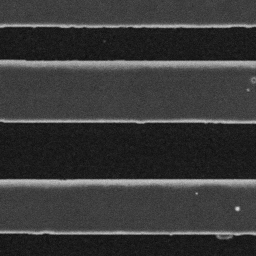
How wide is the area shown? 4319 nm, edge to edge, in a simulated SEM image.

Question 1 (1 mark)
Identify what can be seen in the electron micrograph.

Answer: lines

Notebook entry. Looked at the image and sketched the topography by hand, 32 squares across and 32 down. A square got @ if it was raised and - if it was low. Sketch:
@@@@@@@@@@@@@@@@@@@@@@@@@@@@@@@@
@@@@@@@@@@@@@@@@@@@@@@@@@@@@@@@@
@@@@@@@@@@@@@@@@@@@@@@@@@@@@@@@@
--------------------------------
--------------------------------
--------------------------------
--------------------------------
--------------------------------
@@@@@@@@@@@@@@@@@@@@@@@@@@@@@@@@
@@@@@@@@@@@@@@@@@@@@@@@@@@@@@@@@
@@@@@@@@@@@@@@@@@@@@@@@@@@@@@@@@
@@@@@@@@@@@@@@@@@@@@@@@@@@@@@@@@
@@@@@@@@@@@@@@@@@@@@@@@@@@@@@@@@
@@@@@@@@@@@@@@@@@@@@@@@@@@@@@@@@
@@@@@@@@@@@@@@@@@@@@@@@@@@@@@@@@
--------------------------------
--------------------------------
--------------------------------
--------------------------------
--------------------------------
--------------------------------
--------------------------------
--------------------------------
@@@@@@@@@@@@@@@@@@@@@@@@@@@@@@@@
@@@@@@@@@@@@@@@@@@@@@@@@@@@@@@@@
@@@@@@@@@@@@@@@@@@@@@@@@@@@@@@@@
@@@@@@@@@@@@@@@@@@@@@@@@@@@@@@@@
@@@@@@@@@@@@@@@@@@@@@@@@@@@@@@@@
@@@@@@@@@@@@@@@@@@@@@@@@@@@@@@@@
--------------------------------
--------------------------------
--------------------------------